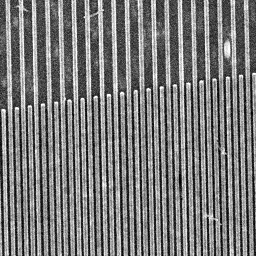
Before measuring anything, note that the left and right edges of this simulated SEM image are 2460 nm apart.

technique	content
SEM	parallel lines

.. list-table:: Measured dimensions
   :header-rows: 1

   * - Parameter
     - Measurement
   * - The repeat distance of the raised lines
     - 0.0636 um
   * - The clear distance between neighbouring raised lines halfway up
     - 32.4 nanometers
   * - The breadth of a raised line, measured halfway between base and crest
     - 3.37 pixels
